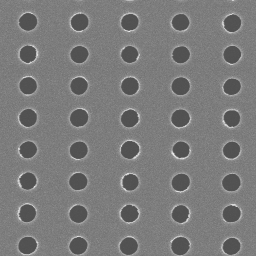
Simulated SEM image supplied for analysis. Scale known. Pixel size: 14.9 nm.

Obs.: a regular array of holes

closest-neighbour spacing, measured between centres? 472 nanometers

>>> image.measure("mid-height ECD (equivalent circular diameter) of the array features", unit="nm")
262